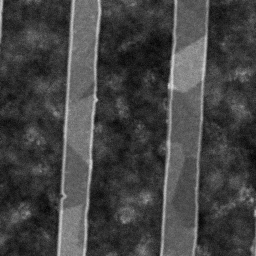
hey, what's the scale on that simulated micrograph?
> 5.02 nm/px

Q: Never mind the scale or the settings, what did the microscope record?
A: one or a few lines or trenches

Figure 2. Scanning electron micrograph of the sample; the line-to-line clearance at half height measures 387 nanometers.